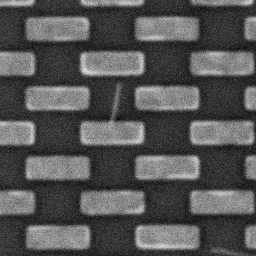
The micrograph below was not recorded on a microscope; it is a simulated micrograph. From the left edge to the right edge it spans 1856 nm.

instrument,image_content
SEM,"groups of lines, slits or small figures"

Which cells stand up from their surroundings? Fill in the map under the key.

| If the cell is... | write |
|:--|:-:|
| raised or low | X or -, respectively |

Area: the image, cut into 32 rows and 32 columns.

X----------XXXX---------XXX-XX--
--------------------------------
----XXXXXX-------XXXXXXXX------X
---XXXXXXXX------XXXXXXXX------X
---XXXXXXXX------XXXXXXXX------X
--------------------------------
--------------------------------
XXXX------XXXXXXXX------XXXXXXXX
XXXX------XXXXXXXX------XXXXXXX-
--------------------------------
--------------------------------
---XXXXXXXX------XXXXXXXX------X
---XXXXXXXX------XXXXXXXX------X
----XXXXXXX------XXXXXXX-------X
--------------------------------
XXXX-------XXXXXX-------XXXXXXX-
XXXX------XXXXXXXX------XXXXXXXX
XXXX------XXXXXXX-------XXXXXXX-
--------------------------------
--------------------------------
---XXXXXXXX------XXXXXXXX------X
---XXXXXXXX------XXXXXXXX------X
--------------------------------
--------------------------------
XXXX------XXXXXXXX------XXXXXXXX
XXXX------XXXXXXXX------XXXXXXXX
XXXX------XXXXXX--------XXXXXXX-
--------------------------------
----XXXXXXX-------XXXXXXX------X
---XXXXXXXX------XXXXXXXX------X
---XXXXXXXX------XXXXXXXX------X
--------------------------------